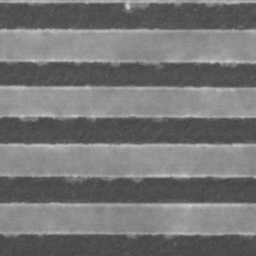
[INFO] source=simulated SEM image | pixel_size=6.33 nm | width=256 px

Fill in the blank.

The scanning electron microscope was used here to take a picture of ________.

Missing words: lines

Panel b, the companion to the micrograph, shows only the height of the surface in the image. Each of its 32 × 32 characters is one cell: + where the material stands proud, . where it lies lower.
................................
................................
................................
................................
++++++++++++++++++++++++++++++++
++++++++++++++++++++++++++++++++
++++++++++++++++++++++++++++++++
++++++++++++++++++++++++++++++++
................................
................................
................................
++++++++++++++++++++++++++++++++
++++++++++++++++++++++++++++++++
++++++++++++++++++++++++++++++++
++++++++++++++++++++++++++++++++
................................
................................
................................
++++++++++++++++++++++++++++++++
++++++++++++++++++++++++++++++++
++++++++++++++++++++++++++++++++
++++++++++++++++++++++++++++++++
................................
................................
................................
++++++++++++++++++++++.++....+..
++++++++++++++++++++++++++++++++
++++++++++++++++++++++++++++++++
++++++++++++++++++++++++++++++++
................................
................................
................................